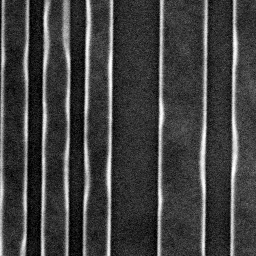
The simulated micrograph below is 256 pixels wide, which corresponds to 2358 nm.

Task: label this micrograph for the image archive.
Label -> groups of lines, slits or small figures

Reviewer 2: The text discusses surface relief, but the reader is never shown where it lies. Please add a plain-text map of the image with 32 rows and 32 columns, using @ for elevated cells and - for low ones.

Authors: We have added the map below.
@@@---@@---@@@------@@@@@@---@@@
@@@---@@---@@@------@@@@@@---@@@
@@@---@@---@@@------@@@@@@---@@@
@@@---@@---@@@------@@@@@@---@@@
@@@---@@---@@@------@@@@@@---@@@
@@@---@@---@@@------@@@@@@---@@@
@@@---@@@--@@@------@@@@@@---@@@
@@@---@@@--@@@------@@@@@@---@@@
@@@--@@@@--@@@------@@@@@@---@@@
@@@--@@@@--@@@------@@@@@@---@@@
@@@--@@@@--@@@------@@@@@@---@@@
@@@--@@@@--@@@------@@@@@@---@@@
@@@--@@@@--@@@------@@@@@@---@@@
@@@--@@@@--@@@------@@@@@@---@@@
@@@---@@@--@@@------@@@@@@---@@@
@@@---@@@--@@@------@@@@@@---@@@
@@@--@@@@--@@@------@@@@@@---@@@
@@@--@@@@--@@@------@@@@@@---@@@
@@@--@@@@--@@@------@@@@@----@@@
@@@--@@@---@@@------@@@@@----@@@
@@@--@@@---@@@------@@@@@----@@@
@@@--@@@---@@@------@@@@@----@@@
@@@--@@@---@@@------@@@@@----@@@
@@@--@@@---@@@------@@@@@@---@@@
@@@--@@@---@@@------@@@@@@---@@@
@@@--@@@---@@@------@@@@@@---@@@
@@@--@@@@-@@@@------@@@@@@---@@@
@@@--@@@@-@@@@------@@@@@@---@@@
@@@--@@@--@@@@------@@@@@@---@@@
@@@--@@@--@@@@------@@@@@----@@@
@@@--@@@--@@@@------@@@@@----@@@
@@@--@@@--@@@@------@@@@@----@@@